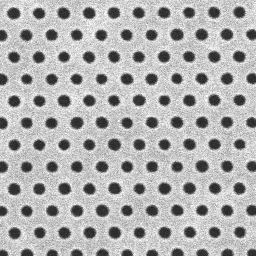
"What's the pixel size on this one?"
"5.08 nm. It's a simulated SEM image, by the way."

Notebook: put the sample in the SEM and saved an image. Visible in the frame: a regular array of holes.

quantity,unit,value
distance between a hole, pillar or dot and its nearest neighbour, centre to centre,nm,126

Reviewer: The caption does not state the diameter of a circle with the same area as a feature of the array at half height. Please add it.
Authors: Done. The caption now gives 63.6 nm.